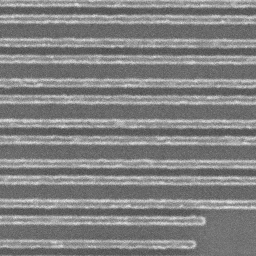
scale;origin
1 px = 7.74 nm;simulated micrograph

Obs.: parallel lines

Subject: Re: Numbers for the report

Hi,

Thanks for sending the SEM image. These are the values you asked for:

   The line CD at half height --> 56.1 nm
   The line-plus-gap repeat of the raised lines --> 158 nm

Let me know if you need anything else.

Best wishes